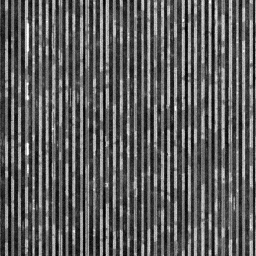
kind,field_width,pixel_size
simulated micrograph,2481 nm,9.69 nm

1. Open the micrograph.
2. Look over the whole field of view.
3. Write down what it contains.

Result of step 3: parallel lines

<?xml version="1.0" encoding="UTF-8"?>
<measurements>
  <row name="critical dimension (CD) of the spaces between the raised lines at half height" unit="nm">41.2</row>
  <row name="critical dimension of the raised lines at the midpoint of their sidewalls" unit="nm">25.4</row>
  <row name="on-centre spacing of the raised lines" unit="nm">65.9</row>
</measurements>